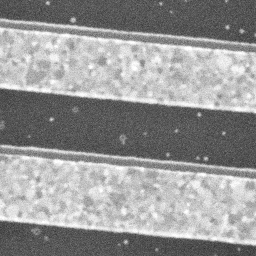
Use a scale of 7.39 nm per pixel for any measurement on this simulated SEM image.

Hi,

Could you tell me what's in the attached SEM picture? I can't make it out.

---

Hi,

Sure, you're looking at lines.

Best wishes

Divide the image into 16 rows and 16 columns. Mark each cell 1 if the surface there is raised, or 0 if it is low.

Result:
0000000000000000
1110000000000000
1111111111111000
1111111111111111
1111111111111111
1111111111111111
0000000000111111
0000000000000000
0000000000000000
1111000000000000
1111111111111100
1111111111111111
1111111111111111
1111111111111111
0000000011111111
0000000000000000